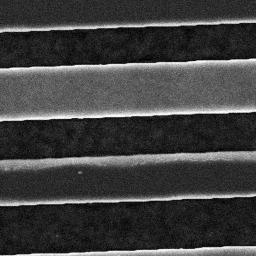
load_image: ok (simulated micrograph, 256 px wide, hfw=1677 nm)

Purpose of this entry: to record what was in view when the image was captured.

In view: lines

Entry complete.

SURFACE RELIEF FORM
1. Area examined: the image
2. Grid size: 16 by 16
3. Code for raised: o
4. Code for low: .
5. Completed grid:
oooooooooooooooo
oooooooooooooo..
................
................
oooooooooooooooo
oooooooooooooooo
oooooooooooooooo
oo..............
................
................
oooooooooooooooo
oooooooooooooooo
ooooooooooo.....
................
................
............oooo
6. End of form